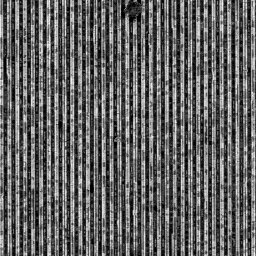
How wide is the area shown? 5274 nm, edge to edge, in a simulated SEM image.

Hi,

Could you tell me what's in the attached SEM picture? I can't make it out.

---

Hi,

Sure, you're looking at parallel lines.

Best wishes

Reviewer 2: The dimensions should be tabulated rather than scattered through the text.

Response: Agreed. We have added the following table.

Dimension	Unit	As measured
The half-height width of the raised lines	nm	69.5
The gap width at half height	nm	103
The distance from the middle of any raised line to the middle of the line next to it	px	7.86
